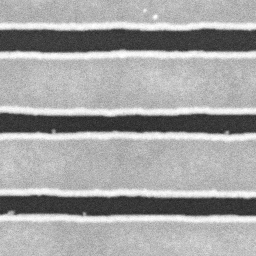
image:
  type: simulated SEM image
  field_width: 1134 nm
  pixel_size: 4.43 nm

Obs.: lines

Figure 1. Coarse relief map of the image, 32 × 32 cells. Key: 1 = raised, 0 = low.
11111111111111111111111111111111
11111111111111111111111111111111
11111111111111111111111111111111
11111111111111011111111110011111
00000000000000000000000000000000
00000000000000000000000000000000
00000000000000000000000000000000
11111111111111111111111111111111
11111111111111111111111111111111
11111111111111111111111111111111
11111111111111111111111111111111
11111111111111111111111111111111
11111111111111111111111111111111
11111111111111111111111111111111
00000000000000000000000000000000
00000000000000000000000000000000
00000000000000000000000000000000
11111111111111111111111111111111
11111111111111111111111111111111
11111111111111111111111111111111
11111111111111111111111111111111
11111111111111111111111111111111
11111111111111111111111111111111
11111111111111111111111111111111
00000000000000000000111111011111
00000000000000000000000000000000
00000000000000000000000000000000
11111111111111111111111111111111
11111111111111111111111111111111
11111111111111111111111111111111
11111111111111111111111111111111
11111111111111111111111111111111